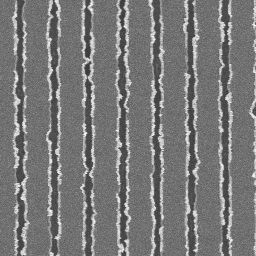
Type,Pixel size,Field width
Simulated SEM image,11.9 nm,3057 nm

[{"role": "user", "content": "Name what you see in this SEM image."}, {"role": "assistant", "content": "parallel lines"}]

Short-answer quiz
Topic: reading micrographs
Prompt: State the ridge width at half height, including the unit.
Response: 333 nm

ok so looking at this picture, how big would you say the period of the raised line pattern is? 409 nanometers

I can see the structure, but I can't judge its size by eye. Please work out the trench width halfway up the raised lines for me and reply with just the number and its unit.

71.6 nm